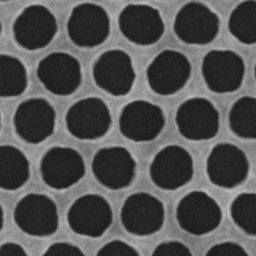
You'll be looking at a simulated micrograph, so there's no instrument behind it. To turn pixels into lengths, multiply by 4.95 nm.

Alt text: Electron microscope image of a regular array of holes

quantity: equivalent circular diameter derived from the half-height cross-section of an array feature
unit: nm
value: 219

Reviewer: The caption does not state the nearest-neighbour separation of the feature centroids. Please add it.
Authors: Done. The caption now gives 261 nanometers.